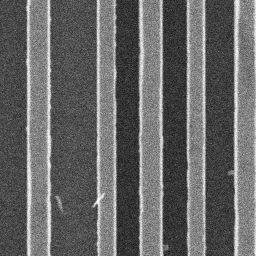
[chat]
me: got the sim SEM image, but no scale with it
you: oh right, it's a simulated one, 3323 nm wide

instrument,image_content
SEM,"lines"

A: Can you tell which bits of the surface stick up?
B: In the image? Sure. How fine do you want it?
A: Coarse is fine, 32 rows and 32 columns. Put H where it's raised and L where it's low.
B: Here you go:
LLLHHHLLLLLLHHLLLLHHLLLHHHLLLHHH
LLLHHHLLLLLLHHLLLHHHLLLHHHLLLHHH
LLLHHHLLLLLLHHLLLLHHLLLHHHLLLHHH
LLLHHHLLLLLLHHLLLLHHLLLHHHLLLHHH
LLLHHHLLLLLLHHLLLLHHLLLHHHLLLHHH
LLLHHHLLLLLLHHLLLLHHLLLHHHLLLHHH
LLLHHHLLLLLLHHLLLLHHLLLHHHLLLHHH
LLLHHHLLLLLLHHLLLLHHLLLHHHLLLHHH
LLLHHHLLLLLLHHLLLLHHLLLHHHLLLHHH
LLLHHHLLLLLLHHLLLLHHLLLHHHLLLHHH
LLLHHHLLLLLLHHLLLLHHLLLHHHLLLHHH
LLLHHHLLLLLLHHLLLLHHLLLHHHLLLHHH
LLLHHHLLLLLLHHLLLLHHLLLHHHLLLHHH
LLLHHHLLLLLLHHLLLLHHLLLHHHLLLHHH
LLLHHHLLLLLLHHLLLLHHLLLHHHLLLHHH
LLLHHHLLLLLLHHLLLLHHLLLHHHLLLHHH
LLLHHHLLLLLLHHLLLLHHLLLHHHLLLHHH
LLLHHHLLLLLLHHLLLLHHLLLHHHLLLHHH
LLLHHHLLLLLLHHLLLLHHLLLHHHLLLHHH
LLLHHHLLLLLLHHLLLLHHLLLHHHLLLHHH
LLLHHHLLLLLLHHLLLLHHLLLLHHLLLHHH
LLLHHHLLLLLLHHLLLLHHLLLHHHLLLHHH
LLLHHHLLLLLLHHLLLLHHLLLHHHLLLHHH
LLLHHHLLLLLLHHLLLLHHLLLHHHLLLHHH
LLLHHHLLLLLLHHLLLLHHLLLLHHLLLHHH
LLLLHHLLLLLLHHLLLLHHLLLHHHLLLHHH
LLLHHHLLLLLLHHLLLLHHLLLHHHLLLHHH
LLLHHHLLLLLLHHLLLLHHLLLHHHLLLHHH
LLLHHHLLLLLLHHLLLLHHLLLLHHLLLHHH
LLLHHHLLLLLLHHLLLLHHLLLHHHLLLHHH
LLLHHHLLLLLLHHLLLLHHLLLHHHLLLHHH
LLLHHHLLLLLLHHLLLLHHLLLLHHLLLHHH